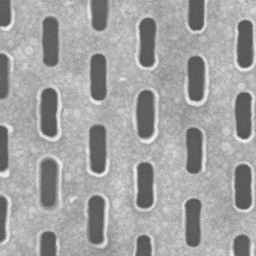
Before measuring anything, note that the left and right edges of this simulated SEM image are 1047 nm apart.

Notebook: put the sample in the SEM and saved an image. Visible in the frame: a regular array of holes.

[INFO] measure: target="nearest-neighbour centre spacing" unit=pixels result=59.5